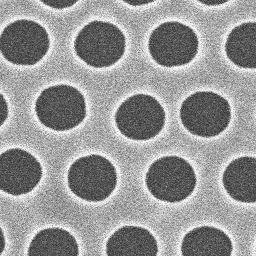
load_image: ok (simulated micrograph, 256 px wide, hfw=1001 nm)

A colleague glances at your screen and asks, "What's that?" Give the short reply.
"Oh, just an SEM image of holes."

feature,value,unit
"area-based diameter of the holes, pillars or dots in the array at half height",192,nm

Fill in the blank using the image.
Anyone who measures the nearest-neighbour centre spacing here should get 286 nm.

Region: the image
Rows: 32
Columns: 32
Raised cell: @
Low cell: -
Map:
@@@@@----@@@@@@@--@@@@@@@---@@@@
@@@@@@@@@@@@@@@@@@@@@@@@@@@@@@@@
@@--@@@@@@@@@@@@@@@@@@@@@@@@@@@@
@-----@@@@-----@@@@@----@@@@@---
------@@@-------@@@------@@@----
------@@@-------@@@------@@@----
------@@@-------@@@------@@@----
@----@@@@@-----@@@@-----@@@@@---
@@@@@@@@@@@@-@@@@@@@@@@@@@@@@@--
@@@@@@@@@@@@@@@@@@@@@@@@@@@@@@@@
@@@@@@@@@@@@@@@@@@@@@@@@@@@@@@@@
@@@@@-----@@@@@@@@@@@@@@@--@@@@@
-@@@@------@@@@@----@@@-----@@@@
-@@@-------@@@@-----@@@------@@@
-@@@@------@@@-------@@------@@@
@@@@@-----@@@@-------@@------@@@
@@@@@@@@@@@@@@@-----@@@@----@@@@
@@@@@@@@@@@@@@@@@-@@@@@@@@@@@@@@
@@@@@@@@@@@@@@@@@@@@@@@@@@@@@@@@
----@@@@@@@--@@@@@@@@-@@@@@@@@@@
-----@@@@-----@@@@@-----@@@@@---
-----@@@@------@@@------@@@@----
-----@@@-------@@@-------@@@----
----@@@@@-----@@@@------@@@@----
@@@@@@@@@@----@@@@@-----@@@@@---
@@@@@@@@@@@@@@@@@@@@@@@@@@@@@@@@
@@@@@@@@@@@@@@@@@@@@@@@@@@@@@@@@
@@@@@@@@@@@@@@@@@@@@@@@@@@@@@@@@
@@@@@@-@@@@@@@@---@@@@@@---@@@@@
-@@@-----@@@@@-----@@@@------@@@
-@@@------@@@-------@@@------@@@
@@@-------@@@-------@@@------@@@